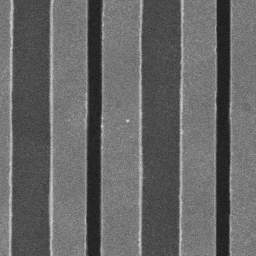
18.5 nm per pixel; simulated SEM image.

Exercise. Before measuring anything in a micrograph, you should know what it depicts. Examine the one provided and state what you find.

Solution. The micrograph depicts lines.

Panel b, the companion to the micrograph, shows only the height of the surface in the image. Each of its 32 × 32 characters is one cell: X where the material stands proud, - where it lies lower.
X------XXXX--XXXXX-----XXXX--XXX
X------XXXX--XXXXX-----XXXX--XXX
X------XXXX--XXXXX-----XXXX--XXX
X------XXXX--XXXXX-----XXXX--XXX
X------XXXX--XXXXX-----XXXX--XXX
X------XXXX--XXXXX-----XXXX--XXX
X------XXXX--XXXXX-----XXXX--XXX
X------XXXX--XXXXX-----XXXX--XXX
X------XXXX--XXXXX-----XXXX--XXX
X------XXXX--XXXXX-----XXXX--XXX
X------XXXX--XXXXX-----XXXX--XXX
X------XXXX--XXXX------XXXX--XXX
X------XXXX--XXXX------XXXX--XXX
X------XXXX--XXXX------XXXX--XXX
X------XXXX--XXXXX-----XXXX--XXX
X------XXXX--XXXX------XXXX--XXX
X------XXXX--XXXX------XXXX--XXX
X------XXXX--XXXX------XXXX--XXX
X------XXXX--XXXX------XXXX--XXX
X------XXXX--XXXX------XXXX--XXX
X------XXXX--XXXX------XXXX--XXX
X------XXXX--XXXX------XXXX--XXX
X------XXXX--XXXX------XXXX--XXX
X-----XXXXX--XXXX------XXXX--XXX
X-----XXXXX--XXXX------XXXX--XXX
X-----XXXXX--XXXX------XXXX--XXX
X------XXXX--XXXX------XXXX--XXX
X-----XXXXX--XXXX------XXXX--XXX
X------XXXX--XXXX------XXXX--XXX
X-----XXXXX--XXXX------XXXX--XXX
X-----XXXXX--XXXX------XXXX--XXX
X-----XXXXX--XXXX------XXXX--XXX